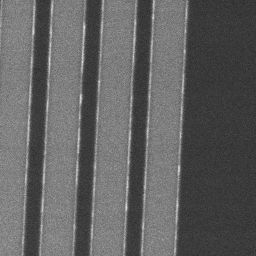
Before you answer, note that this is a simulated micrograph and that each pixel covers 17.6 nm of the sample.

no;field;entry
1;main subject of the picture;parallel lines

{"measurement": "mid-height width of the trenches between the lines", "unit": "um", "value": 0.568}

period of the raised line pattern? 893 nanometers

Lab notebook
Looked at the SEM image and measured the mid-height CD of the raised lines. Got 326 nanometers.